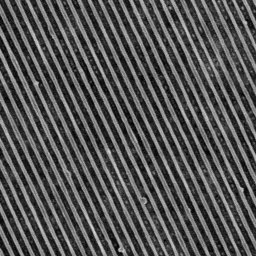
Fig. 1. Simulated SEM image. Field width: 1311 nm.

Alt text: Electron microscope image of parallel lines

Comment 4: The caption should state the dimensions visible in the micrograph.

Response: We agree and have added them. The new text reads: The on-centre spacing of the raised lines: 9.36 px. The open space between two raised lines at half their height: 33.6 nanometres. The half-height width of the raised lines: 0.0145 um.